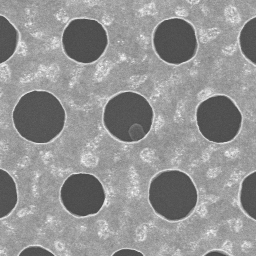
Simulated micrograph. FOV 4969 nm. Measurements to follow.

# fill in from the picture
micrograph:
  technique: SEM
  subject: holes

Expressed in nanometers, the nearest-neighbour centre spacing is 1720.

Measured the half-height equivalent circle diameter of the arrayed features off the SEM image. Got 0.893 um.